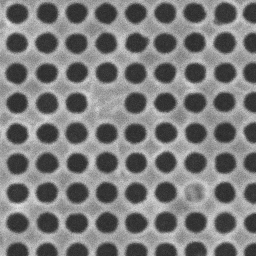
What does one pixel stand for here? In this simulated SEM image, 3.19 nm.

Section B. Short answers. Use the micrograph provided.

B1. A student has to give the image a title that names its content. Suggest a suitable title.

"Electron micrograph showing a regular array of holes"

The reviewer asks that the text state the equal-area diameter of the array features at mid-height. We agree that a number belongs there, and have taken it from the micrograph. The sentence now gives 0.0691 um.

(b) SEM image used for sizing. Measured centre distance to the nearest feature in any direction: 0.0934 micrometres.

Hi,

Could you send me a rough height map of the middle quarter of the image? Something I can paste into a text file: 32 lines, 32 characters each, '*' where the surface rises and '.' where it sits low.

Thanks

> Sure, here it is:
*....***.....***....***.....***.
*.....**......*.....***.....**..
......**......*......*......**..
*.....**.....**.....***.....**..
**..*****...****...*****...****.
********************************
********************************
**...************..*****...****.
*.....*********......**.....**..
......*********......**.....**..
......*********......**.....**..
*....***********....***....****.
********************************
********************************
*************************.******
*....****....***....***.....***.
......**.....**......**.....**..
......**......*......**......*..
*.....**.....**.....***.....***.
*....****...****...*****...****.
********************************
********************************
**..*****...*****...****...****.
*.....**.....***....***.....**..
......**......*......**.....**..
*.....**.....**......**.....**..
*....****....***....****...****.
********************************
********************************
**********.******.*******.******
*....****....***....***.....****
*.....**.....**......**.....****